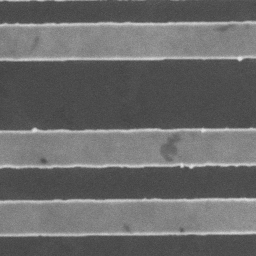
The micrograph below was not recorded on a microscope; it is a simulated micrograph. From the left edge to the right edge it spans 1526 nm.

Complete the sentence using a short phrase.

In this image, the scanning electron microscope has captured lines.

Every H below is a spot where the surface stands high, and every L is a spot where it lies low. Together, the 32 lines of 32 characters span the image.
LLLLLLLLLLLLLLLLLLLLLLLLLLLLLLLL
LLLLLLLLLLLLLLLLLLLLLLLLLLLLLLLL
LLLLLLLLLLLLLLLLLLLLLLLLLLLLLLLL
HHHHHHHHHHHHHHHHHHHHHHHHHHHHHHHH
HHHHHHHHHHHHHHHHHHHHHHHHHHHHHHHH
HHHHHHHHHHHHHHHHHHHHHHHHHHHHHHHH
HHHHHHHHHHHHHHHHHHHHHHHHHHHHHHHH
HHHHLHHHLLLLLLLLLLLLLLLLLLLLLLLL
LLLLLLLLLLLLLLLLLLLLLLLLLLLLLLLL
LLLLLLLLLLLLLLLLLLLLLLLLLLLLLLLL
LLLLLLLLLLLLLLLLLLLLLLLLLLLLLLLL
LLLLLLLLLLLLLLLLLLLLLLLLLLLLLLLL
LLLLLLLLLLLLLLLLLLLLLLLLLLLLLLLL
LLLLLLLLLLLLLLLLLLLLLLLLLLLLLLLL
LLLLLLLLLLLLLLLLLLLLLLLLLLLLLLLL
LLLLLLLLLLLLLLLLLLLLLLLLLLLLLLLL
HHHHHHHHHHHHHHHHHHHHHHHHHHHHHHHH
HHHHHHHHHHHHHHHHHHHHHHHHHHHHHHHH
HHHHHHHHHHHHHHHHHHHHHHHHHHHHHHHH
HHHHHHHHHHHHHHHHHHHHHHHHHHHHHHHH
HHHHHHHHHHHHHHHHHHHHHHHHHHHHHHHH
LLLLLLLLLLLLLLLLLLLLLLLLLLLLLLLL
LLLLLLLLLLLLLLLLLLLLLLLLLLLLLLLL
LLLLLLLLLLLLLLLLLLLLLLLLLLLLLLLL
LLLLLLLLLLLLLLLLLLLLLLLLLLLLLLLL
HHHHHHHHHHHHHHHHHHHHHHHHHHHHHHHH
HHHHHHHHHHHHHHHHHHHHHHHHHHHHHHHH
HHHHHHHHHHHHHHHHHHHHHHHHHHHHHHHH
HHHHHHHHHHHHHHHHHHHHHHHHHHHHHHHH
LLLLLLLLLLLLLLLLLLLLLLLLLLLLLLLL
LLLLLLLLLLLLLLLLLLLLLLLLLLLLLLLL
LLLLLLLLLLLLLLLLLLLLLLLLLLLLLLLL